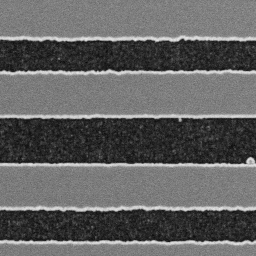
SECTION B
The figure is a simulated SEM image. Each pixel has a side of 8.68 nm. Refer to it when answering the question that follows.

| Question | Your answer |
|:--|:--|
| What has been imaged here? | lines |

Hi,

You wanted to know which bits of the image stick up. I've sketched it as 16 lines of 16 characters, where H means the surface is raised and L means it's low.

HHHHHHHHHHHHHHHH
HHHHHHHHHHHHHHHH
LLLLLLLLLLHLLLLL
LLLLLLLLLLLLLLLL
HHHHLHHHHHHHHHHH
HHHHHHHHHHHHHHHH
HHHHHHHHHHHHHHHH
LLLLLLLLLLLLLLLL
LLLLLLLLLLLLLLLL
LLLLLLLLLLLLLLLL
HHHHHHHHHHHHHHHH
HHHHHHHHHHHHHHHH
HHHHHHHHHHHHHHHH
LLLLLLLLLLLLLLLL
LLLLLLLLLLLLLLLL
HHHHHHHHHHHHHHHH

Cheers